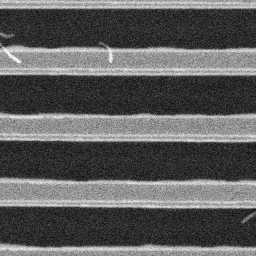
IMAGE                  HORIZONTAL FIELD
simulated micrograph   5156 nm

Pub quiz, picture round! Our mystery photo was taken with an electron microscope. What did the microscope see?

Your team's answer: lines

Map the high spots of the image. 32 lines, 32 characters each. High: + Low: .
++++++++++++++++++++++++++++++++
................................
................................
................................
................................
................................
++++++++++++++++++++++++++++++++
++++++++++++++++++++++++++++++++
++++++++++++++++++++++++++++++++
................................
................................
................................
................................
................................
................................
++++++++++++++++++++++++++++++++
++++++++++++++++++++++++++++++++
......................++++++++++
................................
................................
................................
................................
................................
++++++++++++++++++++++++++++++++
++++++++++++++++++++++++++++++++
++++++++++++++++++++++++++++++++
................................
................................
................................
................................
................................
++++++++++++++++++++++++++++++++